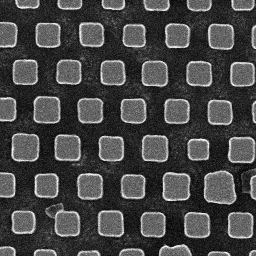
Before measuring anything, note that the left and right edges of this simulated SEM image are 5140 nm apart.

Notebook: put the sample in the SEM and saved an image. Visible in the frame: a regular array of raised bodies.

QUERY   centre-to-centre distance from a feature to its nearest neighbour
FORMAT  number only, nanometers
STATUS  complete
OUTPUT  856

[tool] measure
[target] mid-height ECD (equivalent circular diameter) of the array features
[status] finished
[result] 0.531 micrometres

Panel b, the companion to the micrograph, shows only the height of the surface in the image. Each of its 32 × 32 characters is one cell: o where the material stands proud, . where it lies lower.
..ooo..ooo...ooo..ooo..ooo...ooo
................................
................................
oo...oo...ooo...oo...oo...ooo...
oo...oo...ooo..ooo...ooo..ooo...
oo...oo...ooo...oo...oo...ooo...
................................
................................
..ooo..ooo...oo...ooo...oo...ooo
..ooo..ooo...ooo..ooo..ooo...ooo
...o..........o...ooo...oo...oo.
................................
oo..ooo...oo....oo..............
oo..ooo...ooo..ooo...ooo..ooo...
oo..ooo...ooo..ooo...ooo..ooo...
...........................oo...
................................
..ooo..ooo..ooo...ooo...oo...ooo
..ooo..ooo..ooo...ooo...oo...ooo
..ooo..ooo..ooo...ooo...oo...ooo
................................
...........................o....
oo..ooo...ooo..ooo..oooo..ooo..o
oo..ooo...ooo..ooo..oooo..ooo..o
oo...oo...ooo...oo..oooo..ooo...
................................
..oo.........oo.................
.ooo...ooo..ooo...ooo..ooo...oo.
..oo...ooo..ooo...ooo..ooo...ooo
........................oo...oo.
................................
oo..ooo...oo...ooo..oooo.......o